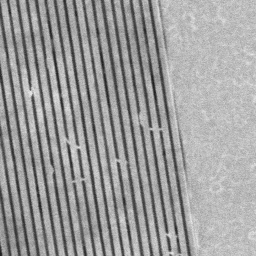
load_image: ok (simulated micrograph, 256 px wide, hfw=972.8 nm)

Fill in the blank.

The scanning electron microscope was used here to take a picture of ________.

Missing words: parallel lines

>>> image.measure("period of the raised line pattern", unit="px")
9.34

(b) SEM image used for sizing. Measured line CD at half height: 23.9 nm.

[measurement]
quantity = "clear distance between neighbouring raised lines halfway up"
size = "10.3 nm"